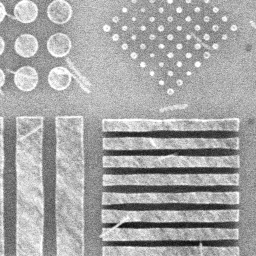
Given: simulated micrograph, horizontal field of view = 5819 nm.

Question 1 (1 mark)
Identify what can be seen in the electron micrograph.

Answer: groups of lines, slits or small figures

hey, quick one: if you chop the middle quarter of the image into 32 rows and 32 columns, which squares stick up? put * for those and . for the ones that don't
................................
*...............................
*...............................
*...............................
*...............................
*...............................
................................
................................
................................
................................
................................
................................
................................
*****...........................
*****.....**********************
*****.....**********************
*****.....************..........
*****...........................
*****...........................
*****.....**********************
*****.....**********************
*****...........................
*****...........................
*****.....**********************
*****.....**********************
*****.....**********************
*****...........................
*****...........................
*****.....**********************
*****.....**********************
*****...........................
*****...........................